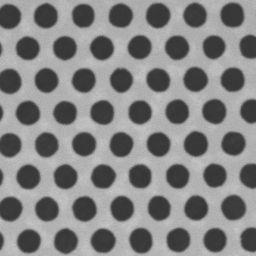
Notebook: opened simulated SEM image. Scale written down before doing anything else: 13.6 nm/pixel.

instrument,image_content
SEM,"a regular array of holes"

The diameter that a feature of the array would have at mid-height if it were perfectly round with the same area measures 0.324 um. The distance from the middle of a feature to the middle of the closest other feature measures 36.8 pixels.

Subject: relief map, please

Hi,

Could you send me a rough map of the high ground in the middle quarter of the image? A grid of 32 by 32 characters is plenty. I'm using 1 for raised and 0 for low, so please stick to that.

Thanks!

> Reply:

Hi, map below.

11111111111111111111111111111111
11100001111110001111110001111110
11100000111100000111100000111100
11000000111000000111100000111100
11000000111000000111100000011100
11000000111100000111100000111100
11100001111110001111110000111110
11111111111111111111111111111111
11111111111111111111111111111111
01111111000111111100111111000011
00011110000011111000001111000001
00011110000011110000001110000001
00011100000011110000001110000001
00011110000011111000001111000001
00111111000011111000011111100011
11111111111111111111111111111111
11111111111111111111111111111111
11110011111110001111110001111110
11000001111100000111100000111110
11000000111100000111100000011100
11000000111000000111100000111100
11000000111100000111100000111100
11100001111100001111110001111110
11111111111111111111111111111111
11111111111111111111111111111111
01111111000111111000111111100011
00011110000011110000011111000001
00011110000001110000001111000001
00011110000001110000001111000001
00011110000001110000001111000001
00111111000011111000011111100011
11111111111111111111111111111111